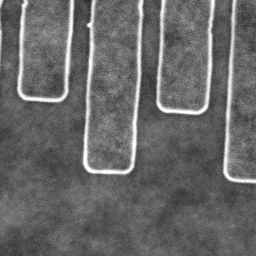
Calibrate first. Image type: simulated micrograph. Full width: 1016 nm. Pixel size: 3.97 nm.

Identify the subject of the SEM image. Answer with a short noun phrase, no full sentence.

one or a few lines or trenches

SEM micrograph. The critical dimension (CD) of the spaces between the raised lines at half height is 0.0822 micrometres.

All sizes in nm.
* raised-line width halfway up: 199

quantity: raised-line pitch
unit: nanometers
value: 278